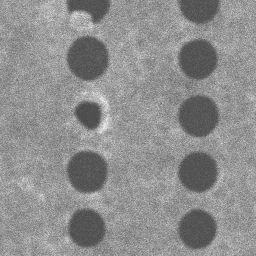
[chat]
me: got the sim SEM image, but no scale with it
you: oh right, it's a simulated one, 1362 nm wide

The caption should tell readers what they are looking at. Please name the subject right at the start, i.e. holes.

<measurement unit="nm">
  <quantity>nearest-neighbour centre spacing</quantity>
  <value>301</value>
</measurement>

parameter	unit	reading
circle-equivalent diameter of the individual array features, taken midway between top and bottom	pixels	40.9